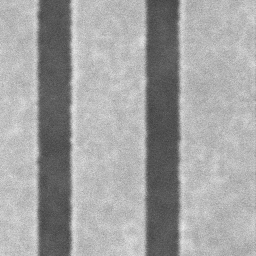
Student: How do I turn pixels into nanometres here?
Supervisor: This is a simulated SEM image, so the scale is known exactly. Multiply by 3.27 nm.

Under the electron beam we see lines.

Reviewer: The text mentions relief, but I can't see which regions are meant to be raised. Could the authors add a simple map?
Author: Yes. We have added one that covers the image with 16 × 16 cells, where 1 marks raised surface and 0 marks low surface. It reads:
1100011110011111
1100011110011111
1100011110011111
1100011110011111
1100011110011111
1100011110011111
1100011110011111
1100011110011111
1100011110011111
1100011110011111
1100011110011111
1100011110011111
1100011110011111
1100011110011111
1100011110011111
1100011110011111